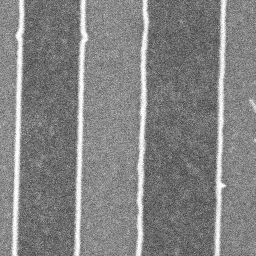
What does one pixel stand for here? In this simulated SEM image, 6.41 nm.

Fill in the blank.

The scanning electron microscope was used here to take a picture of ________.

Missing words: one or a few lines or trenches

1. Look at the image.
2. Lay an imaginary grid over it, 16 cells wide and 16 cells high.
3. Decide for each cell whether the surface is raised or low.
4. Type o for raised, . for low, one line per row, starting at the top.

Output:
.oooo....ooooo..
.oooo....ooooo..
.oooo....ooooo..
.oooo....ooooo..
.oooo....ooooo..
.oooo....ooooo..
.oooo....ooooo..
.oooo....ooooo..
.oooo....ooooo..
.oooo....ooooo..
.oooo....ooooo..
.oooo....ooooo..
.oooo....ooooo..
.oooo....ooooo..
.oooo....ooooo..
.oooo....ooooo..